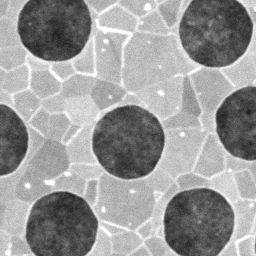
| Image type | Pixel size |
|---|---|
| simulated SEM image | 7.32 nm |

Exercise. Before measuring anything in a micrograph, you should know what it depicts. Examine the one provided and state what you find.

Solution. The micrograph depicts holes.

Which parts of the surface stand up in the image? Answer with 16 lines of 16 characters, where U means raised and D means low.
UDDDDDUUUUUUDDDU
UDDDDDUUUUUDDDDD
UDDDDDUUUUUDDDDD
UUDDDUUUUUUUDDDU
UUUUUUUUUUUUUUUU
UUUUUUUUUUUUUUUD
UUUUUUUUUUUUUUDD
DUUUUUDDDDUUUDDD
DDUUUUDDDDUUUUDD
DDUUUUDDDDUUUUDD
DUUUUUDDDDUUUUUU
UUUUUUUUUUUUUUUU
UUDDDUUUUUUDDDUU
UUDDDDUUUUDDDDDU
UUDDDDUUUUDDDDDU
UUDDDDUUUUUDDDUU